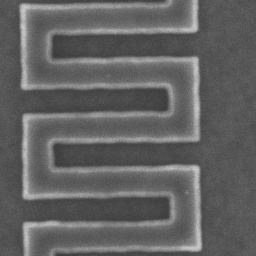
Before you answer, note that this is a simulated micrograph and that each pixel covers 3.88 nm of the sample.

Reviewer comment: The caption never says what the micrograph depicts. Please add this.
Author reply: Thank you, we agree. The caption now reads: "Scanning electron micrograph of groups of lines, slits or small figures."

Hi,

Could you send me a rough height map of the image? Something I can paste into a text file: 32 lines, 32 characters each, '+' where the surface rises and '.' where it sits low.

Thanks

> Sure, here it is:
....................++++........
...+++++++++++++++++++++........
...+++++++++++++++++++++........
...+++++++++++++++++++++........
...+++..........................
...+++..........................
...+++..........................
...++++..+++.+++++++++++........
...++++++++++++++++++++++.......
...++++++++++++++++++++++.......
...++++++++++++++++++++++.......
.....................++++.......
.....................++++.......
.....................++++.......
......+++++++++++++++++++.......
...++++++++++++++++++++++.......
...++++++++++++++++++++++.......
...++++++++++++++++++++.........
...+++..........................
...+++..........................
...++++.........................
...++++++++++++++++++++++.......
...++++++++++++++++++++++.......
...++++++++++++++++++++++.......
...++++..............++++.......
.....................++++.......
......................+++.......
.....................++++.......
...++++++++++++++++++++++.......
...++++++++++++++++++++++.......
...++++++++++++++++++++++.......
...++++.........................